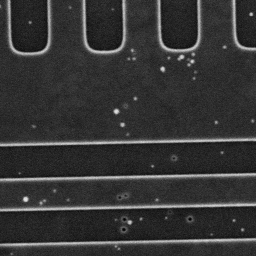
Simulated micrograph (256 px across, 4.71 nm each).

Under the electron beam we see groups of lines, slits or small figures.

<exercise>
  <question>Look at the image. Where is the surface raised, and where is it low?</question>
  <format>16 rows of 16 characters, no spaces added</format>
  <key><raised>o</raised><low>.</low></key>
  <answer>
o..oo...oo..ooo.
o..oo...oo..ooo.
o..oo...oo..ooo.
oooooooooooooooo
oooooooooooooooo
oooooooooooooooo
oooooooooooooooo
oooooooooooooooo
oooooooooooooooo
................
................
oooooooooooooooo
oooooooooooooooo
................
................
oooooooooooooooo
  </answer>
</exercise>